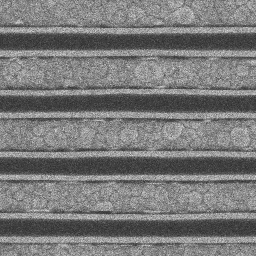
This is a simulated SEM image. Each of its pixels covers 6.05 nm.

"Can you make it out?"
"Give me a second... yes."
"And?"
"parallel lines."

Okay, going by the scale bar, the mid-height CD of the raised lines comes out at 146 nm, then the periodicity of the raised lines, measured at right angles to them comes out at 0.376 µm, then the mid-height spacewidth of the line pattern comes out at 230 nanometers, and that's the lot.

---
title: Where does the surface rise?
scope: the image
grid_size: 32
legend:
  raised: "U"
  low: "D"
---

DDDDDDDDDDDDDDDDDDDDDDDDDDDDDDDD
DDDDDDDDDDDDDDDDDDDDDDDDDDDDDDDD
DDDDDDDDDDDDDDDDDDDDDDDDDDDDDDDD
DDDDDDDDDDDDDDDDDDDDDDDDDDDDDDDD
UUUUUUUUUUUUUUUUUUUUUUUUUUUUUUUU
UUUUUUUUUUUUUUUUUUUUUUUUUUUUUUUU
UUUUUUUUUUUUUUUUUUUUUUUUUUUUUUUU
DDDDDDDDDDDDDDDDDDDDDDDDDDDDDDDD
DDDDDDDDDDDDDDDDDDDDDDDDDDDDDDDD
DDDDDDDDDDDDDDDDDDDDDDDDDDDDDDDD
DDDDDDDDDDDDDDDDDDDDDDDDDDDDDDDD
DDDDDDDDDDUUUUUUUUUUUUUUUUUDDDDD
UUUUUUUUUUUUUUUUUUUUUUUUUUUUUUUU
UUUUUUUUUUUUUUUUUUUUUUUUUUUUUUUU
DDDDDDDDDDDDDDDDDDDDDDDDDDDDDDDD
DDDDDDDDDDDDDDDDDDDDDDDDDDDDDDDD
DDDDDDDDDDDDDDDDDDDDDDDDDDDDDDDD
DDDDDDDDDDDDDDDDDDDDDDDDDDDDDDDD
DDDDDDDDDDDDDDDDDDDDDDDDDDDDDDDD
UUUUUUUUUUUUUUUUUUUUUUUUUUUUUUUU
UUUUUUUUUUUUUUUUUUUUUUUUUUUUUUUU
UUUUUUUUUUUUUUUUUUUUUUUUUUUUUUUU
DDDDDDDDDDDDDDDDDDDDDDDDDDDDDDDD
DDDDDDDDDDDDDDDDDDDDDDDDDDDDDDDD
DDDDDDDDDDDDDDDDDDDDDDDDDDDDDDDD
DDDDDDDDDDDDDDDDDDDDDDDDDDDDDDDD
DDDDDDDDDDDDDDDDDDDDDDDDDDDDDDDD
UUUUUUUUUUUUUUUUUUUUUUUUUUUUUUUU
UUUUUUUUUUUUUUUUUUUUUUUUUUUUUUUU
UUUUUUUUUUUUUUUUUUUUUUUUUUUUUUUU
DDDDDDDDDDDDDDDDDDDDDDDDDDDDDDDD
DDDDDDDDDDDDDDDDDDDDDDDDDDDDDDDD